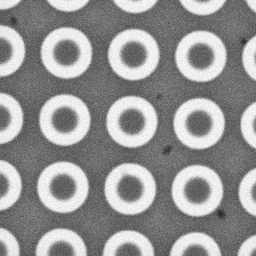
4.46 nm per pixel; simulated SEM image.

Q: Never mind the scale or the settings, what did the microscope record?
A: an array of small figures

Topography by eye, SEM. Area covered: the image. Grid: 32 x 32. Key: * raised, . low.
**....*****....****....*****...*
................**......***.....
................................
*...............................
**....*****....****....****.....
***..******...******..******...*
***..******...******..******..**
***..******...******..******..**
**....*****...*****...******...*
.......***.....***.....****....*
................................
................................
**....****.....***......**......
***..******...*****...*****....*
***..******..*******..******..**
***..******..*******..******..**
**...******...*****...******..**
*.....****....*****....****....*
........................**......
................................
*......**.......................
**...*****....*****....****....*
***..******..******...******..**
***..******..******...******..**
**...******..******...******..**
**....****....*****...*****...**
.......**......***.....***.....*
................................
................................
**...*****....****.....***......
**...*****...******...*****...**
**...******..******..******...**